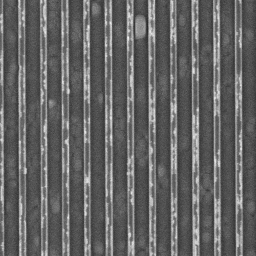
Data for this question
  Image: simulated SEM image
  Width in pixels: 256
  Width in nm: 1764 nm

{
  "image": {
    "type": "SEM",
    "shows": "parallel lines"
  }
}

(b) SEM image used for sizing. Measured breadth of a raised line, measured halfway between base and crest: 40.5 nm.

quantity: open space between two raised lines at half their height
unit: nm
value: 106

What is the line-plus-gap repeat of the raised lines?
149 nm